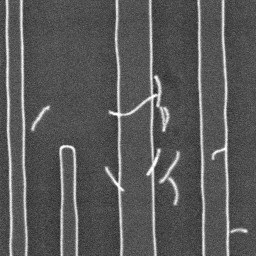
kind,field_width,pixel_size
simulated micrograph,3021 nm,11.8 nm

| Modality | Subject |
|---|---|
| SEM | groups of lines, slits or small figures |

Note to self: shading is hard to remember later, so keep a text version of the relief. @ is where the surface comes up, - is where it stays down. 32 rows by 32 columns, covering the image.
-@@------------@@@@------@@@----
-@@------------@@@@------@@@----
-@@------------@@@@------@@@----
-@@------------@@@@------@@@----
-@@-----------@@@@@------@@@----
-@@-----------@@@@@------@@@----
-@@------------@@@@------@@@----
-@@------------@@@@------@@@----
-@@------------@@@@------@@@----
-@@------------@@@@------@@@----
-@@------------@@@@------@@@----
-@@------------@@@@------@@@----
-@@------------@@@@------@@@----
-@@------------@@@@------@@@----
-@@------------@@@@------@@@----
-@@------------@@@@------@@@----
-@@------------@@@@------@@@----
-@@------------@@@@------@@@----
-@@-----@------@@@@------@@@----
-@@-----@------@@@@------@@@----
-@@-----@------@@@@------@@@----
-@@-----@------@@@@------@@@----
-@@-----@------@@@@------@@@----
-@@-----@------@@@@------@@@----
-@@-----@------@@@@------@@@----
-@@-----@------@@@@------@@@----
-@@-----@@-----@@@@------@@@----
-@@-----@@-----@@@@------@@@@---
-@@-----@@-----@@@@------@@@@---
-@@-----@@-----@@@@------@@@@---
-@@-----@@-----@@@@------@@@----
-@@-----@@-----@@@@------@@@@---